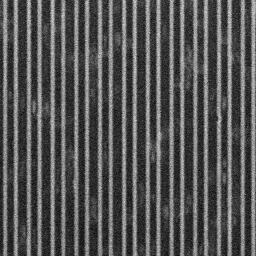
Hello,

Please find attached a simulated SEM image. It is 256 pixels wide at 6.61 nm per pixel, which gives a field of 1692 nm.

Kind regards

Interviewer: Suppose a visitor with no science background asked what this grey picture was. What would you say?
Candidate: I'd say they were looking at parallel lines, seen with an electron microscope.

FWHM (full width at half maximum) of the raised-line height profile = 17.3 nm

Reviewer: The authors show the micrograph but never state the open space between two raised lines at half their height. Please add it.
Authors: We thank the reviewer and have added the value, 52.9 nm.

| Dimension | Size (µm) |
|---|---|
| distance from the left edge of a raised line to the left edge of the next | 0.0781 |